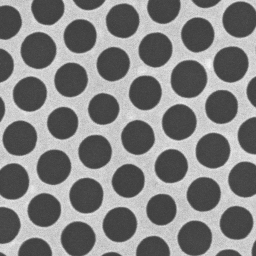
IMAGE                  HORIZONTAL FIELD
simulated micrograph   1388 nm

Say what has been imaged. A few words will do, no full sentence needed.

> a regular array of holes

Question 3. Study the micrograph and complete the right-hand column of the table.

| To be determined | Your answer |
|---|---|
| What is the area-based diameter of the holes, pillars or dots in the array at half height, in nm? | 187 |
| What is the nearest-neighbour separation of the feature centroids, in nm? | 235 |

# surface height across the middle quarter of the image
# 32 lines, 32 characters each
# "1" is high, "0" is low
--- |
00001111000000001111100001110000
00000111000000001111111111100000
00000011100000001111111111100000
00000011110000011100000111100000
00000011111111111000000011100000
00000011111111110000000011100000
00000111111111110000000001100000
00001111000111110000000001110000
11111110000001110000000011111100
11111100000000111000000011111111
11111100000000111100000111100001
00111100000000111110011111000000
00011100000000111111111110000000
00001110000001111111111110000000
00001110000011110000111100000000
00011111111111100000001110000000
00011111111111100000001110000000
00011111111111000000000110000000
01111000001111000000000111000001
11110000000111000000000111111111
11110000000011100000001111111111
11110000000011100000011110001111
01100000000011111000111100000011
01110000000011111111111000000011
00110000000111111111111000000001
00111000001111000011110000000001
00111111111110000001111000000001
00111111111100000000111000000001
01111001111100000000111100000011
11100000011100000000111110001111
11000000011100000000111111111110
10000000001110000000111111111110